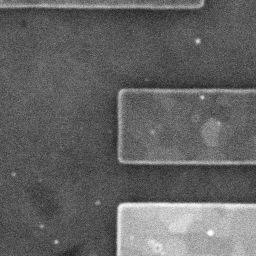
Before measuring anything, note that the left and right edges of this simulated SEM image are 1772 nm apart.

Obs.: wiring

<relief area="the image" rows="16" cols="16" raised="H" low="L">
LLLLLLLLLLLLLLLL
LLLLLLLLLLLLLLLL
LLLLLLLLLLLLLLLL
LLLLLLLLLLLLLLLL
LLLLLLLLLLLLLLLL
LLLLLLLLLLLLLLLL
LLLLLLLHHHHHHHHH
LLLLLLLHHHHHHHHH
LLLLLLLHHHHHHHHH
LLLLLLLHHHHHHHHH
LLLLLLLLLLLLLLLL
LLLLLLLLLLLLLLLL
LLLLLLLLLLLLLLLL
LLLLLLLHHHHHHHHH
LLLLLLLHHHHHHHHH
LLLLLLLHHHHHHHHH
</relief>